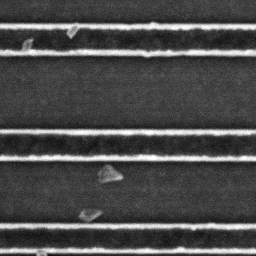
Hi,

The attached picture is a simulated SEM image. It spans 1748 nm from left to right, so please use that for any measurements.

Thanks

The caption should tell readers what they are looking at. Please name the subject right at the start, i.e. one or a few lines or trenches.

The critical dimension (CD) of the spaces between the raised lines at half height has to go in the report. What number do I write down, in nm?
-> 490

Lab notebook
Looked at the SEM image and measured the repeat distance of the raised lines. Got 682 nm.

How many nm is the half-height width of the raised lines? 184